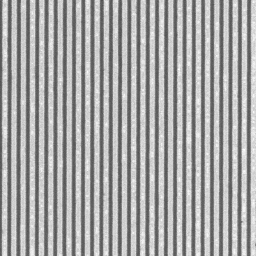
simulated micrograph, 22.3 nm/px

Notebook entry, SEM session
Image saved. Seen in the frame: parallel lines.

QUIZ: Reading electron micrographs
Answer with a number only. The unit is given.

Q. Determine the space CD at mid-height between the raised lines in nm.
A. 83.8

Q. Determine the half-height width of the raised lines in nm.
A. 126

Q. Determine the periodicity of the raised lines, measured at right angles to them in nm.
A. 206